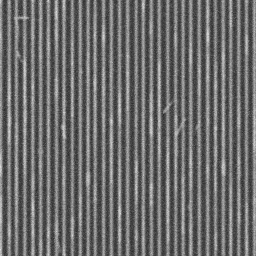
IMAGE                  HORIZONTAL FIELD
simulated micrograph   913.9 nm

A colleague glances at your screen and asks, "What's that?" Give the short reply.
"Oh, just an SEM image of parallel lines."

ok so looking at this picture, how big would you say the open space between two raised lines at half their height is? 18.8 nanometers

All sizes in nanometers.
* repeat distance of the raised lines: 28.3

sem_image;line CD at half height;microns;0.0094